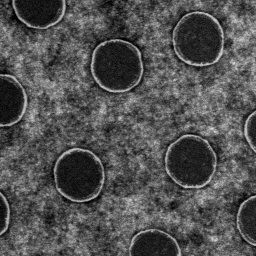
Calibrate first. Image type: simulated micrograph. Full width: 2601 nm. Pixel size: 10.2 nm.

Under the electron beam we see raised bodies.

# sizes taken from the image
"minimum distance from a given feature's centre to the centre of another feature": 1010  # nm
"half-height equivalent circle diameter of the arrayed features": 522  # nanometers